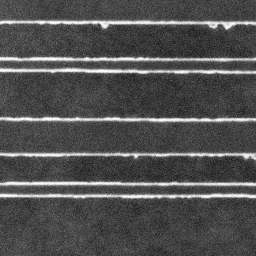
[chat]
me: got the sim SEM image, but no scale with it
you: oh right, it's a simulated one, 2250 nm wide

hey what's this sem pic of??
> lines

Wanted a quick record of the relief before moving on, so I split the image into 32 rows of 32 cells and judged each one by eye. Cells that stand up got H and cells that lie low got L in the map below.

HHHHHHHHHHHHHHHHHHHHHHHHHHHHHHHH
HHHHHHHHHHHHHHHHHHHHHHHHHHHHHHHH
HHHHHHHHHHHHHHHHHHHHHHHHHHHHHHHH
LLLLLLLLLLLLLLLLLLLLLLLLLLLLLLLL
LLLLLLLLLLLLLLLLLLLLLLLLLLLLLLLL
LLLLLLLLLLLLLLLLLLLLLLLLLLLLLLLL
LLLLLLLLLLLLLLLLLLLLLLLLLLLLLLLL
HHHHHHHHHHHHHHHHHHHHHHHHHHHHHHHH
HHHHHHHHHHHHHHHHHHHHHHHHHHHHHHHH
LLLLLLLLLLLLLLLLLLLLLLLLLLLLLLLL
LLLLLLLLLLLLLLLLLLLLLLLLLLLLLLLL
LLLLLLLLLLLLLLLLLLLLLLLLLLLLLLLL
LLLLLLLLLLLLLLLLLLLLLLLLLLLLLLLL
LLLLLLLLLLLLLLLLLLLLLLLLLLLLLLLL
LLLLLLLLLLLLLLLLLLLLLLLLLLLLLLLL
HHHHHHHHHHHHHHHHHHHHHHHHHHHHHHHH
HHHHHHHHHHHHHHHHHHHHHHHHHHHHHHHH
HHHHHHHHHHHHHHHHHHHHHHHHHHHHHHHH
HHHHHHHHHHHHHHHHHHHHHHHHHHHHHHHH
LLLLLLLLLLLLLLLLLLLLLLLLLLLLLLLL
LLLLLLLLLLLLLLLLLLLLLLLLLLLLLLLL
LLLLLLLLLLLLLLLLLLLLLLLLLLLLLLLL
LLLLLLLLLLLLLLLLLLLLLLLLLLLLLLLL
HHHHHHHHHHHHHHHHHHHHHHHHHHHHHHHH
HHHHHHHHHHHHHHHHHHHHHHHHHHHHHHHH
LLLLLLLLLLLLLLLLLLLLLLLLLLLLLLLL
LLLLLLLLLLLLLLLLLLLLLLLLLLLLLLLL
LLLLLLLLLLLLLLLLLLLLLLLLLLLLLLLL
LLLLLLLLLLLLLLLLLLLLLLLLLLLLLLLL
LLLLLLLLLLLLLLLLLLLLLLLLLLLLLLLL
LLLLLLLLLLLLLLLLLLLLLLLLLLLLLLLL
LLLLLLLLLLLLLLLLLLLLLLLLLLLLLLLL